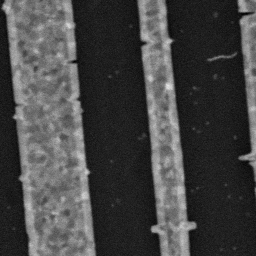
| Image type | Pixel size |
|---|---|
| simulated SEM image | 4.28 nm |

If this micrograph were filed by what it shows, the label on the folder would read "one or a few lines or trenches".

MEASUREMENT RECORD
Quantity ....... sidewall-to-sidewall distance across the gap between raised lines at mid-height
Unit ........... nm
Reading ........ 310